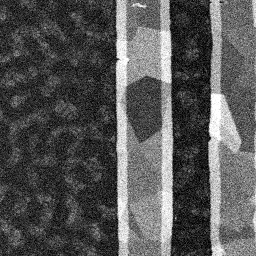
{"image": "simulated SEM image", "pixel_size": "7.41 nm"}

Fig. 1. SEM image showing one or a few lines or trenches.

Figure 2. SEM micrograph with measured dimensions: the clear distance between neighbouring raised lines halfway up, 0.363 µm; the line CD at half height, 331 nm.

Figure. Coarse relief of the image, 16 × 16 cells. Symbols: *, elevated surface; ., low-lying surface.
........**...***
........**....**
........**....**
........**....**
........**....**
........**....**
........**....**
........**...***
........**...***
........**...***
........**...***
........**...***
........**...***
........**...***
........**...***
........**....**